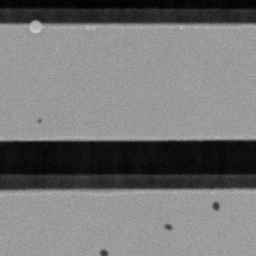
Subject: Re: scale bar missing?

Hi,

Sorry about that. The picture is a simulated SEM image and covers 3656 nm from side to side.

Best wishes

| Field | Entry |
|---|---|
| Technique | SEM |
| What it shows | lines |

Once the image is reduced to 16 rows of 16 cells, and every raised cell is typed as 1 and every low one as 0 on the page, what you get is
0000000000000000
1111111111111111
1111111111111111
1111111111111111
1111111111111111
1111111111111111
1111111111111111
1111111111111111
1111111111111111
0000000000000000
0000000000000000
0000000000000000
1111111111111111
1111111111111111
1111111111111111
1111111111111111